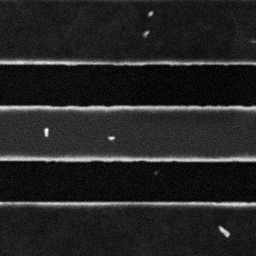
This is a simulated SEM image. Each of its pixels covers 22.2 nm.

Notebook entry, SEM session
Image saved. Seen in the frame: lines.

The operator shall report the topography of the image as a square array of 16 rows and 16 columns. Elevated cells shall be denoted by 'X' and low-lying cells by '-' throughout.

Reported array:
XXXXXXXXXXXXXXXX
XXXXXXXXXXXXXXXX
XXXXXXXXXXXXXXXX
XXXXXXXXXXXXXXXX
----------------
----------------
----------------
XXXXXXXXXXXXXXXX
XXXXXXXXXXXXXXXX
XXXXXXXXXXXXXXXX
----------------
----------------
----------------
XXXXXXXXXXXXXXXX
XXXXXXXXXXXXXXXX
XXXXXXXXXXXXXXXX